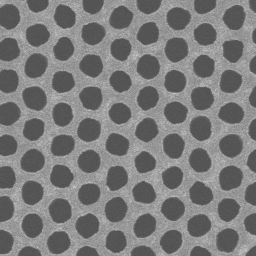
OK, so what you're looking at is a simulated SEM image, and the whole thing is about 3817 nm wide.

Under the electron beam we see a regular array of holes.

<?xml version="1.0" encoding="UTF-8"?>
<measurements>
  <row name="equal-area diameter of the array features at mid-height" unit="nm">342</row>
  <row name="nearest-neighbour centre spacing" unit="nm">464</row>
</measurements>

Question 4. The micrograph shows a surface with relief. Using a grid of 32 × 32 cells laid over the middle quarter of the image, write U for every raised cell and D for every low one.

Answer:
UUUUDDDDDDUUUUUUUUDDDDDDUUUUUUUU
UUUUDDDDDDUUUUUUUUDDDDDDUUUDUUUU
DDUUUDDDDUUUDDDDUUUDDDDDUUDDDDUU
DDUUUUUUUUUDDDDDDUUUDDUUUDDDDDUU
DDDUUUUUUUUDDDDDDUUUUUUUUDDDDDUU
DDDUUUUUUUUUDDDDDUUUUUUUUDDDDDUU
DDUUUDDDDUUUUDDDUUUDDDDUUUDDDDUU
UUUUDDDDDDUUUUUUUUUDDDDDUUUUUUUU
UUUUDDDDDDUUUUUUUUDDDDDDUUUUUUUU
UUUUDDDDDUUUUUUUUUDDDDDUUUUDUUUU
DDUUUDDDDUUUDDDDUUUDDDDUUDDDDDUU
DDUUUUUDUUUDDDDDDUUUDUUUUDDDDDDU
DDUUUUUUUUUDDDDDDUUUUUUUUDDDDDDU
DDUUUDDUUUUDDDDDDUUUUUUUUDDDDDUU
DDUUDDDDUUUUDDDDUUUDDDDUUUDDDDUU
DUUUDDDDDUUUUUUUUUDDDDDUUUUUUUUU
UUUDDDDDDUUUUUUUUUDDDDDDUUUUUUUD
UUUDDDDDDUUUDUUUUUDDDDDDUUUDUUUU
DDUUDDDDUUUDDDDUUUDDDDDUUDDDDUUU
DDDUUUUUUUUDDDDDUUUUDUUUUDDDDDUU
DDDUUUUUUUDDDDDDUUUUUUUUUDDDDDUU
DDUUUUUUUUUDDDDDUUUUUUUUUDDDDDUU
DUUUDDDDDUUUDDDUUUUDDDUUUUDDDDUU
UUUUDDDDDUUUUUUUUUDDDDDUUUUDDUUD
UUUUDDDDDUUUUUUUUUDDDDDUUUUUUUUD
UUUUDDDDDUUUUDUUUUDDDDDUUUUDUUUU
DDUUUDDDUUUDDDDUUUDDDDUUUUDDDUUU
DDUUUUUUUUUDDDDDUUUUUUUUUDDDDDUU
DDUUUUUUUUUDDDDDUUUUUUUUDDDDDDUU
DDUUUUUUUUUDDDDDUUUDDUUUUDDDDUUU
DUUUDDDDDUUDDDDUUUDDDDUUUDDDDUUU
UUUUDDDDDUUUDDUUUDDDDDDUUUUUUUUD